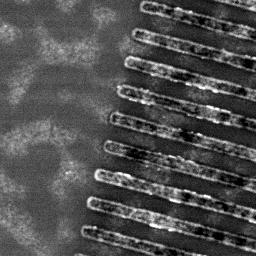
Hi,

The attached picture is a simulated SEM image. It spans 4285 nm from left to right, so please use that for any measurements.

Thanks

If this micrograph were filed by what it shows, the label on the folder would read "parallel lines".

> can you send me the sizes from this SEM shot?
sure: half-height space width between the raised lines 18.7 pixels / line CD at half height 164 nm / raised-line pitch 486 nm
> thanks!